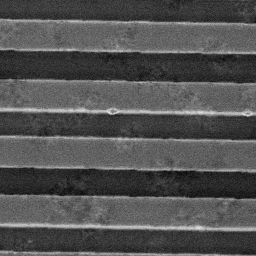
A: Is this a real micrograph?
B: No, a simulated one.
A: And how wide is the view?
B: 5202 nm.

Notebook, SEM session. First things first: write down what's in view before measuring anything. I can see lines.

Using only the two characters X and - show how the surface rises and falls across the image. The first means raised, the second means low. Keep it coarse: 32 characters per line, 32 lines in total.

--------------------------------
--------------------------------
--------------------------------
XXXXXXXXXXXXXXXXXXXXXXXXXXXXXXXX
XXXXXXXXXXXXXXXXXXXXXXXXXXXXXXXX
XXXXXXXXXXXXXXXXXXXXXXXXXXXXXXXX
---------------------XXXXXXXXXXX
--------------------------------
--------------------------------
--------------------------------
XXXXXXXXXXXXXXXXXXXXXXXXXXX-----
XXXXXXXXXXXXXXXXXXXXXXXXXXXXXXXX
XXXXXXXXXXXXXXXXXXXXXXXXXXXXXXXX
XXXXXXXXXXXXXXXXXXXXXXXXXXXXXXXX
--------------------------------
--------------------------------
--------------------------------
XXXXXXXXXXXXXXXXXXXXXXX---------
XXXXXXXXXXXXXXXXXXXXXXXXXXXXXXXX
XXXXXXXXXXXXXXXXXXXXXXXXXXXXXXXX
XXXXXXXXXXXXXXXXXXXXXXXXXXXXXXXX
--------------------------------
--------------------------------
--------------------------------
XXXXX---------------------------
XXXXXXXXXXXXXXXXXXXXXXXXXXXXXXXX
XXXXXXXXXXXXXXXXXXXXXXXXXXXXXXXX
XXXXXXXXXXXXXXXXXXXXXXXXXXXXXXXX
------------------------XXXXXXXX
--------------------------------
--------------------------------
--------------------------------